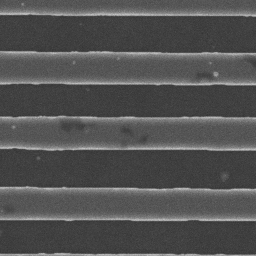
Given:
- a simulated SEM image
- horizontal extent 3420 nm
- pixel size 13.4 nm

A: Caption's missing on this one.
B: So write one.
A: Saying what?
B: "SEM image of lines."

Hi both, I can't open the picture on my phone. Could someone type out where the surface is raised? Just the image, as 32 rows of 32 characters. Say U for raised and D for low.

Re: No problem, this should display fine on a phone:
UUUUUUUUUUUUUUUUUUUUUUUUUUUUUUUU
UUUUUUUUUUUUUUUUUUUUUUUUUUUUUUUU
DDDDDDDDDDDDDDDDDDDDDDDDDDDDDDDD
DDDDDDDDDDDDDDDDDDDDDDDDDDDDDDDD
DDDDDDDDDDDDDDDDDDDDDDDDDDDDDDDD
DDDDDDDDDDDDDDDDDDDDDDDDDDDDDDDD
UUUUUDDDDDDUUUDDDDDDDDDDDDDDDDDD
UUUUUUUUUUUUUUUUUUUUUUUUUUUUUUUU
UUUUUUUUUUUUUUUUUUUUUUUUUUUUUUUU
UUUUUUUUUUUUUUUUUUUUUUUUUUUUUUUU
DDDDDDDDDDDDDDDDDDDUDDUUUUDDUUUU
DDDDDDDDDDDDDDDDDDDDDDDDDDDDDDDD
DDDDDDDDDDDDDDDDDDDDDDDDDDDDDDDD
DDDDDDDDDDDDDDDDDDDDDDDDDDDDDDDD
DDDDDDDDDDDDDDDDDDDDDDDDDDDDDDDD
UUUUUUUUUUUUUUUUUUUUUUUUUUUUUUUU
UUUUUUUUUUUUUUUUUUUUUUUUUUUUUUUU
UUUUUUUUUUUUUUUUUUUUUUUUUUUUUUUU
UUUUUUUUUUUUUUUUUUUUUUUUUUUUUUUU
DDDDDDDDDDDDDDDDDDDDDDDDDDDDDDDD
DDDDDDDDDDDDDDDDDDDDDDDDDDDDDDDD
DDDDDDDDDDDDDDDDDDDDDDDDDDDDDDDD
DDDDDDDDDDDDDDDDDDDDDDDDDDDDDDDD
UUUUUDDUUDDDDDDDDDDDDDDDDDDDDDDD
UUUUUUUUUUUUUUUUUUUUUUUUUUUUUUUU
UUUUUUUUUUUUUUUUUUUUUUUUUUUUUUUU
UUUUUUUUUUUUUUUUUUUUUUUUUUUUUUUU
DDDDDDDDUDDDDDDDUUUUUUUUDUUUUUUU
DDDDDDDDDDDDDDDDDDDDDDDDDDDDDDDD
DDDDDDDDDDDDDDDDDDDDDDDDDDDDDDDD
DDDDDDDDDDDDDDDDDDDDDDDDDDDDDDDD
DDDDDDDDDDDDDDDDDDDDDDDDDDDDDDDD